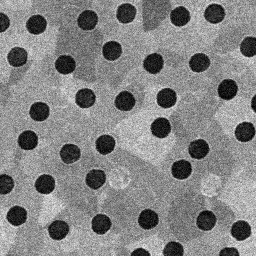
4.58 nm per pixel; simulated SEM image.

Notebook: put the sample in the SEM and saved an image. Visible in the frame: a regular array of holes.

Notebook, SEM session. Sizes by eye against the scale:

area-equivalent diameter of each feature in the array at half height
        0.098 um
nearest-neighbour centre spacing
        172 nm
